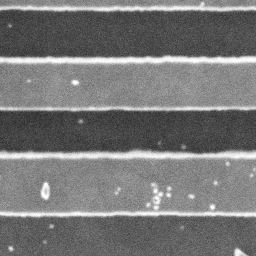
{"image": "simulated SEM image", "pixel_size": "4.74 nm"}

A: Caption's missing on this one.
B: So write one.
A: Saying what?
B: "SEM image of lines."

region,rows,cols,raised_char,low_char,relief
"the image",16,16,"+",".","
++++++++++++++++
................
................
................
++++++++++++++++
++++++++++++++++
++++++++++++++++
................
................
................
++++++++++++++++
++++++++++++++++
++++++++++++++++
................
................
................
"